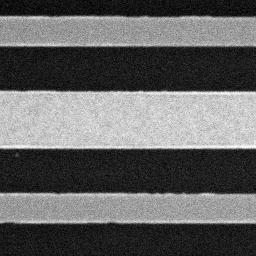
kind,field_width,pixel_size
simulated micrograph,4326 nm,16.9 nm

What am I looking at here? lines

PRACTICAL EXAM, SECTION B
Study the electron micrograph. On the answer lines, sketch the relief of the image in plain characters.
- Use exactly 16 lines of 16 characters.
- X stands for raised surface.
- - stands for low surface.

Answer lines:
----------------
XXXXXXXXXXXXXXXX
XXXXXXXXXXXXXXXX
----------------
----------------
----------------
XXXXXXXXXXXXXXXX
XXXXXXXXXXXXXXXX
XXXXXXXXXXXXXXXX
----------------
----------------
----------------
XXXXXXXXXXXXXXXX
XXXXXXXXXXXXXXXX
----------------
----------------